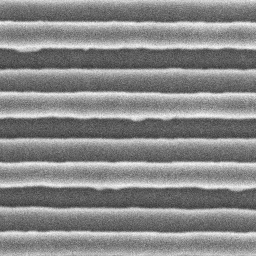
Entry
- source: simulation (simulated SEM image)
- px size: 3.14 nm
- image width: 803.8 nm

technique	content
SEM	lines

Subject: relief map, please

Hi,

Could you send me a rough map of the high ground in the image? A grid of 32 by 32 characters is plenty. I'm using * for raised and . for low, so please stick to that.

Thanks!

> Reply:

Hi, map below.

................................
................................
................................
********************************
********************************
********************************
................................
................................
................................
................................
................................
................................
********************************
********************************
********************************
................................
................................
................................
................................
................................
********************************
********************************
********************************
................................
................................
................................
................................
................................
................................
********************************
********************************
********************************